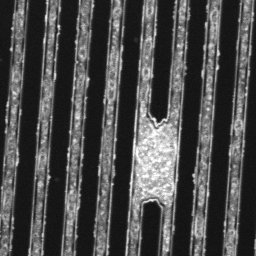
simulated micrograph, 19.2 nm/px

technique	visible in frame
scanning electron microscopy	parallel lines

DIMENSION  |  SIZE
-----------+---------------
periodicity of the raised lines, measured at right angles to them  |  616 nm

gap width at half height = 210 nm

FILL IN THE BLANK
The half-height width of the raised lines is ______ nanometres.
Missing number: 402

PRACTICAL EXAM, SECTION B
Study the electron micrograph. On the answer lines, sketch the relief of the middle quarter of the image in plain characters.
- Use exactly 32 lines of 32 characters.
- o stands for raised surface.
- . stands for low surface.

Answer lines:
ooo...ooooo...ooooo...ooooo...oo
ooo...ooooo...ooooo...ooooo...oo
ooo...ooooo...ooooo...ooooo...oo
ooo...ooooo...ooooo...ooooo...oo
ooo..oooooo...ooooo...ooooo...oo
ooo..ooooo....ooooo...ooooo...oo
ooo..ooooo....oooo....oooo....oo
oo...ooooo....oooo...ooooo....oo
oo...ooooo...ooooo....oooo....oo
oo...ooooo...ooooo...ooooo...ooo
oo...ooooo...ooooo...ooooo...ooo
oo...ooooo...ooooo...ooooo...ooo
oo...ooooo...ooooo...ooooo...ooo
oo...ooooo...ooooo....oooo...ooo
oo...ooooo...ooooo.....o.....ooo
oo...ooooo...ooooo...........ooo
oo...ooooo...ooooo...........ooo
oo...ooooo...ooooo...........ooo
oo...ooooo...ooooo...........ooo
o...oooooo...ooooo...........ooo
o...ooooo....ooooo...........ooo
o...ooooo....oooo............ooo
o...ooooo...ooooo............ooo
o...ooooo...ooooo...........oooo
o...ooooo...ooooo...........oooo
o...ooooo...ooooo...........oooo
o...ooooo...ooooo...........oooo
o...ooooo...ooooo...........oooo
o...ooooo...ooooo...........oooo
o...ooooo...ooooo...........oooo
o...ooooo...ooooo...........oooo
o...ooooo...ooooo...........oooo